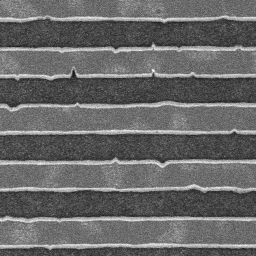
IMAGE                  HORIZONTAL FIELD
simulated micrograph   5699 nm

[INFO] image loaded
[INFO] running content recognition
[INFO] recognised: parallel lines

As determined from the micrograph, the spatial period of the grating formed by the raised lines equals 1260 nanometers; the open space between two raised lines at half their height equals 657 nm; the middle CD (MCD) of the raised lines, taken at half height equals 0.615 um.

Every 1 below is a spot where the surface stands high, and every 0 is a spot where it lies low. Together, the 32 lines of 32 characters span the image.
11111111111111111111111111111111
11111111111111111111111111111111
00000000000000000000110000000000
00000000000000000000000000000000
00000000000000000000000000000000
00000000000000000000000000000000
11111111111111111111111111111111
11111111111111111111111111111111
11111111111111111111111111111111
11100111000000000000000000111000
00000000000000000000000000000000
00000000000000000000000000000000
00000000000000000000000000000000
10111111111111111111111111111111
11111111111111111111111111111111
11111111111111111111111111111111
11111111111100000000001111111011
00000000000000000000000000000000
00000000000000000000000000000000
00000000000000000000000000000000
11111111111111111111011111111111
11111111111111111111111111111111
11111111111111111111111111111111
11111111111111111111110001111111
00000000000000000000000000000000
00000000000000000000000000000000
00000000000000000000000000000000
11101110111111111111111111111111
11111111111111111111111111111111
11111111111111111111111111111111
11111111111111111111111111111111
00000000000000000000000000000000